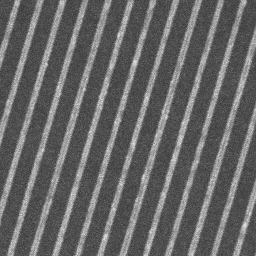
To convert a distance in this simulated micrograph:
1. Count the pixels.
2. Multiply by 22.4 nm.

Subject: parallel lines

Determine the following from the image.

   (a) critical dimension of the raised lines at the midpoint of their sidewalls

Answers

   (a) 4.31 px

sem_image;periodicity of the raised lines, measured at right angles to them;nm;486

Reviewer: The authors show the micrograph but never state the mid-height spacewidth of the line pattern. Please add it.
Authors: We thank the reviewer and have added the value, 384 nm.